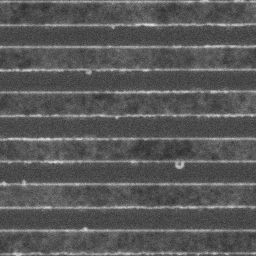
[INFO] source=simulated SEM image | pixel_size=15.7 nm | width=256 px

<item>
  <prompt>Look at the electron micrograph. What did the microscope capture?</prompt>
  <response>lines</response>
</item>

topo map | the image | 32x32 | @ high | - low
@@@@@@@@@@@@@@@@@@@@@@@@@@@@@@@@
@@@@@@@@@@@@@@@@@@@@@@@@@@@@@@@@
@@@@@@@@@@@@@@@@@@@@@@@@@@@@@@@@
--------------------------------
--------------------------------
--------------------------------
@@@@@@@@@@@@@@@@@@@@@@@@@@@@@@@@
@@@@@@@@@@@@@@@@@@@@@@@@@@@@@@@@
@@@@@@@@@@@@@@@@@@@@@@@@@@@@@@@@
--------------------------------
--------------------------------
------------@@@@@@@@@@@@@@@@@@@@
@@@@@@@@@@@@@@@@@@@@@@@@@@@@@@@@
@@@@@@@@@@@@@@@@@@@@@@@@@@@@@@@@
--------------------------------
--------------------------------
--------------------------------
@@@@@@@@@@@@@@@@@@@@@@@@@@@@@@@@
@@@@@@@@@@@@@@@@@@@@@@@@@@@@@@@@
@@@@@@@@@@@@@@@@@@@@@@@@@@@@@@@@
----------------------@---------
--------------------------------
--------------------------------
@@@@@@@@@@@@@@@@@@@@@@@@@@@@@@@@
@@@@@@@@@@@@@@@@@@@@@@@@@@@@@@@@
@@@@@@@@@@@@@@@@@@@@@@@@@@@@@@@@
--------------------------------
--------------------------------
--------------------------------
@@@@@@@@@@@@@@@@@@@@@@@@@@@@@@@@
@@@@@@@@@@@@@@@@@@@@@@@@@@@@@@@@
@@@@@@@@@@@@@@@@@@@@@@@@@@@@@@@@